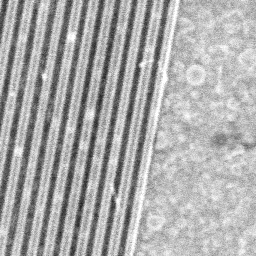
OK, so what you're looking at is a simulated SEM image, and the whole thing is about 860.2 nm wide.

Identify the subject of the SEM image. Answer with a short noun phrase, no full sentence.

parallel lines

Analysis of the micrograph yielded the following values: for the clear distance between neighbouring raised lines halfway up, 0.0268 micrometres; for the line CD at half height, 26.8 nanometres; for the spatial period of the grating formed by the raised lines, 53.3 nm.